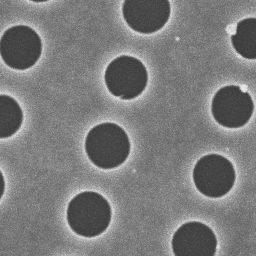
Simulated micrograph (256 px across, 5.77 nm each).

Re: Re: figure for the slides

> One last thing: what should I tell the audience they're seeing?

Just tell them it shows holes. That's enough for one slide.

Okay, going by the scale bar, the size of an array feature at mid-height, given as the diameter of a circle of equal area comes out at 0.249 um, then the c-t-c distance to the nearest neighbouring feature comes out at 409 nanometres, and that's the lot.